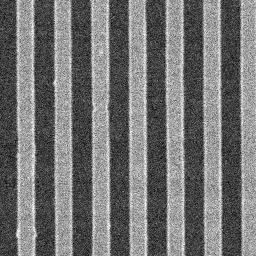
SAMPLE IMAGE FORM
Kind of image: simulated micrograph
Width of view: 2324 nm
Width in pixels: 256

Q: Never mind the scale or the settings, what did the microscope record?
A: parallel lines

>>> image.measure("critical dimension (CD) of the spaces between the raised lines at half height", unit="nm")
201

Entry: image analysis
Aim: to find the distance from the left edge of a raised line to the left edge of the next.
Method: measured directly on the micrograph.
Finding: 339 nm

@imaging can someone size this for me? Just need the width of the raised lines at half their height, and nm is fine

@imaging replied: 137